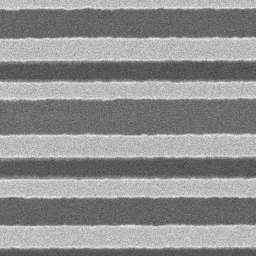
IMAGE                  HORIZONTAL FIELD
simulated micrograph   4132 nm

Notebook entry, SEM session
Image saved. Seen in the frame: lines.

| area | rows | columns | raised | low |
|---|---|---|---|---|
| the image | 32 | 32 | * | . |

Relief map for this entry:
********************************
................................
................................
................................
................................
********************************
********************************
********************************
................................
................................
********************************
********************************
................................
................................
................................
................................
................................
********************************
********************************
********************************
................................
................................
********************************
********************************
********************************
................................
................................
................................
********************************
********************************
********************************
................................